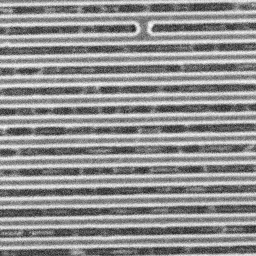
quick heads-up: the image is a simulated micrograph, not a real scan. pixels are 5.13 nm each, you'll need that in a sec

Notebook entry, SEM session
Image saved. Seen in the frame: parallel lines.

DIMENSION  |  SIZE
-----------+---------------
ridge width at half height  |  47.4 nm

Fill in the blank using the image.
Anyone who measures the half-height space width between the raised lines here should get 52.6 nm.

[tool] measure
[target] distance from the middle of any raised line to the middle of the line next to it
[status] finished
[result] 104 nanometers